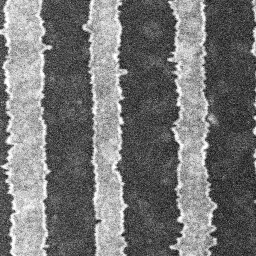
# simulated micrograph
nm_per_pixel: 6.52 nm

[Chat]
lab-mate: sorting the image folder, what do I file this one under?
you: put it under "one or a few lines or trenches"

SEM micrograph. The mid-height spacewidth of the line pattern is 346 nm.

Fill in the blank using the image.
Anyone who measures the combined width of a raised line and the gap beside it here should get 0.54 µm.